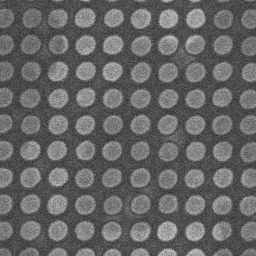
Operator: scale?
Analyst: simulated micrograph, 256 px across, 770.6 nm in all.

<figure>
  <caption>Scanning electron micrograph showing a regular array of raised bodies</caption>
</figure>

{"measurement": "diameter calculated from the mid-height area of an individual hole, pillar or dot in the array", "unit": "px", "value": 18.7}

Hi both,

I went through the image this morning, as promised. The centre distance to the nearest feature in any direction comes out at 0.0787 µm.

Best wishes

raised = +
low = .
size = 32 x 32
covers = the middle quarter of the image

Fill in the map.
....+++...++++....+++....+++...+
+..+++++..++++...+++++..++++...+
...++++...++++...++++...++++...+
....+++...++++...++++...++++...+
................................
................................
....+++....++...................
+..+++++..++++...++++...++++...+
+..+++++..++++...+++++..++++...+
+..++++...++++...++++...++++...+
.....+.....++.....++....+++....+
................................
................................
....+++....+++....+++....+++....
+..+++++..+++++..++++...++++...+
+..+++++..+++++..++++...++++..++
...++++...++++...++++...++++...+
....++..........................
................................
................................
....+++...++++...++++....+++...+
...+++++..++++...++++...++++...+
...++++...++++...++++...++++...+
....+++....++.....++....++++...+
................................
................................
....++.....++.....++............
+..++++...++++...++++...++++...+
+..++++...++++...++++...++++..++
...++++...++++...++++...++++..++
....++.....++.....++....+++....+
................................